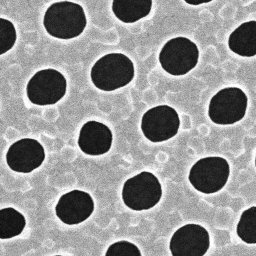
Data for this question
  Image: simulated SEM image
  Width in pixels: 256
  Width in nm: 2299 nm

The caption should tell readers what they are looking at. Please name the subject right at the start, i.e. a regular array of holes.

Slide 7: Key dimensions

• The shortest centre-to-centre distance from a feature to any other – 621 nanometers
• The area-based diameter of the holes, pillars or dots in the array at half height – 346 nm